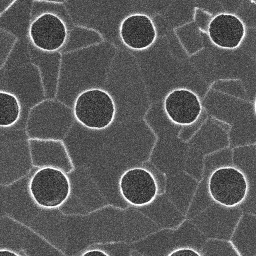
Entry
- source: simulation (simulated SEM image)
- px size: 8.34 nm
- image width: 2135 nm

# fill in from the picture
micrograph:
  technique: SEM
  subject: a regular array of holes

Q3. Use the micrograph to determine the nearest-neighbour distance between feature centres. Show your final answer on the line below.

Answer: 736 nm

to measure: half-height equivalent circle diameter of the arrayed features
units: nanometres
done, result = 290